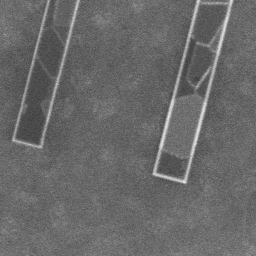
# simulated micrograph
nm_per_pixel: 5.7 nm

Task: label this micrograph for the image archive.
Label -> one or a few lines or trenches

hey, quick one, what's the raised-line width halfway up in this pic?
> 185 nanometers